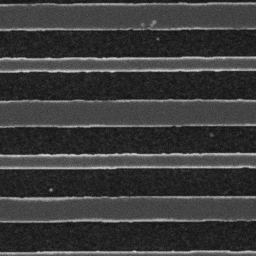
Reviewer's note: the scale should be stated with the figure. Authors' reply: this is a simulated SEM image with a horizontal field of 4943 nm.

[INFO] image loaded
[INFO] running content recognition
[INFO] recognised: lines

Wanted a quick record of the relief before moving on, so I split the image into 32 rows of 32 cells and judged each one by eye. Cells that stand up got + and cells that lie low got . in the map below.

.....++....+......++++++.+++++++
++++++++++++++++++++++++++++++++
++++++++++++++++++++++++++++++++
++++++++++++++++++++++++++++++++
................................
................................
................................
++++++++++++++++++++++++++++++++
++++++++++++++++++++++++++++++++
................................
................................
................................
................................
++++++++++++++++++++++++++++++++
++++++++++++++++++++++++++++++++
++++++++++++++++++++++++++++++++
................................
................................
................................
++++++++++++++++++++++++++++++++
++++++++++++++++++++++++++++++++
................................
................................
................................
................................
++++++++++++++++++++++++++++++++
++++++++++++++++++++++++++++++++
++++++++++++++++++++++++++++++++
................................
................................
................................
........................+++++...